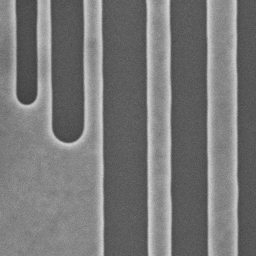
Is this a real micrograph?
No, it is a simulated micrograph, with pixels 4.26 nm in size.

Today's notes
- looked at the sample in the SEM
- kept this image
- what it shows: groups of lines, slits or small figures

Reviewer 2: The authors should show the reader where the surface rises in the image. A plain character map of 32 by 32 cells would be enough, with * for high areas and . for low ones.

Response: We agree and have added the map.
**...*.....**.....***.....****..
**...*.....**.....***.....****..
**...*.....**.....***.....***...
**...*.....**.....***.....***...
**...*.....**.....***.....****..
**...*.....**.....***.....****..
**...*.....**.....***.....***...
**...*.....**.....***.....***...
**...*.....**.....***.....****..
**...*.....**.....***.....****..
**...*.....**.....***.....****..
**...*.....**.....***.....****..
**..**.....**.....***.....****..
******.....**.....***.....****..
******.....**......**.....****..
******.....**.....***.....****..
*******...***.....***.....****..
*******...***......**.....****..
*************......**.....****..
*************......**.....****..
*************......**.....****..
*************......**.....****..
*************......**.....****..
*************......**.....****..
*************......**.....****..
*************......**.....****..
*************......**.....****..
*************......**.....****..
*************......**.....****..
*************......**.....****..
*************......**.....****..
*************......**.....****..